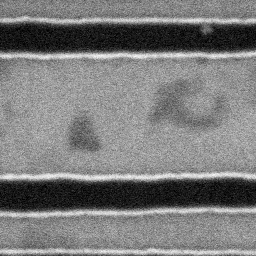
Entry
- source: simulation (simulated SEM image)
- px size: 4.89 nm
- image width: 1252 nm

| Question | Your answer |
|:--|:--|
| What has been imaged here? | lines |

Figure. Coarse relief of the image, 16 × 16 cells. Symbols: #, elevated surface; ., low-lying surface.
................
################
################
###############.
................
................
................
................
................
................
................
################
################
................
................
................